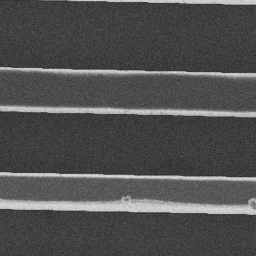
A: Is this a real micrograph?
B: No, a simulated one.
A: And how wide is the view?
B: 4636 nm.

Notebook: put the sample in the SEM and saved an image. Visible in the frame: lines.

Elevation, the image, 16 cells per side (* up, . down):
................
................
................
................
************....
****************
****************
................
................
................
................
****************
****************
................
................
................